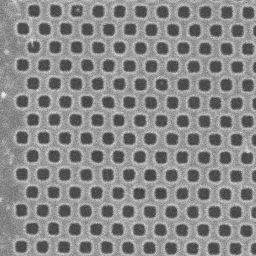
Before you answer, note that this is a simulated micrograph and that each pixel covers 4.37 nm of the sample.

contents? a regular array of holes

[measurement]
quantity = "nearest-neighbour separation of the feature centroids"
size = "90.3 nanometers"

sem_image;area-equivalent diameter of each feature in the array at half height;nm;61.4